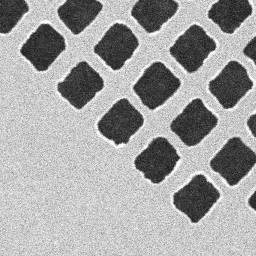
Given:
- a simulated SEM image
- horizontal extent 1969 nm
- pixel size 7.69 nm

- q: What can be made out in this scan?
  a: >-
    a regular array of holes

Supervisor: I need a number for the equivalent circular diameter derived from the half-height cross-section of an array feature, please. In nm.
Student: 321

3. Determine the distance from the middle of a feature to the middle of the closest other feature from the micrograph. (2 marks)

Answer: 52.5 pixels